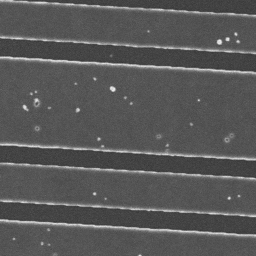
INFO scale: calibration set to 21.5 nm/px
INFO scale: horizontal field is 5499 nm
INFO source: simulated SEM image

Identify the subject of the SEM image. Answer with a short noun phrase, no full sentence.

lines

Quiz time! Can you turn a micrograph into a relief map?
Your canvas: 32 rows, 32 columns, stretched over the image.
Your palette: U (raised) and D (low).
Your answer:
UUUUUUUUDDDDDDDDDDDDDDDDDDDDDDDD
UUUUUUUUUUUUUUUUUUUUUUUUUDDDDDDD
UUUUUUUUUUUUUUUUUUUUUUUUUUUUUUUU
UUUUUUUUUUUUUUUUUUUUUUUUUUUUUUUU
UUUUUUUUUUUUUUUUUUUUUUUUUUUUUUUU
DDDDDDDDDDDDUUUUUUUUUUUUUUUUUUUU
DDDDDDDDDDDDDDDDDDDDDDDDDDDDDDUU
UUUUUUUDDDDDDDDDDDDDDDDDDDDDDDDD
UUUUUUUUUUUUUUUUUUUUUUUDDDDDDDDD
UUUUUUUUUUUUUUUUUUUUUUUUUUUUUUUU
UUUUUUUUUUUUUUUUUUUUUUUUUUUUUUUU
UUUUUUUUUUUUUUUUUUUUUUUUUUUUUUUU
UUUUUUUUUUUUUUUUUUUUUUUUUUUUUUUU
UUUUUUUUUUUUUUUUUUUUUUUUUUUUUUUU
UUUUUUUUUUUUUUUUUUUUUUUUUUUUUUUU
UUUUUUUUUUUUUUUUUUUUUUUUUUUUUUUU
UUUUUUUUUUUUUUUUUUUUUUUUUUUUUUUU
UUUUUUUUUUUUUUUUUUUUUUUUUUUUUUUU
DDDDDDDDUUUUUUUUUUUUUUUUUUUUUUUU
DDDDDDDDDDDDDDDDDDDDDDDUUUUUUUUU
UUDDDDDDDDDDDDDDDDDDDDDDDDDDDDDD
UUUUUUUUUUUUUUUUUUDDDDDDDDDDDDDD
UUUUUUUUUUUUUUUUUUUUUUUUUUUUUUUU
UUUUUUUUUUUUUUUUUUUUUUUUUUUUUUUU
UUUUUUUUUUUUUUUUUUUUUUUUUUUUUUUU
DDDDDDUUUUUUUUUUUUUUUUUUUUUUUUUU
DDDDDDDDDDDDDDDDDDDDDDUUUUUUUUUU
DDDDDDDDDDDDDDDDDDDDDDDDDDDDDDDD
UUUUUUUUUUUUUUUUUDDDDDDDDDDDDDDD
UUUUUUUUUUUUUUUUUUUUUUUUUUUUUUUU
UUUUUUUUUUUUUUUUUUUUUUUUUUUUUUUU
UUUUUUUUUUUUUUUUUUUUUUUUUUUUUUUU